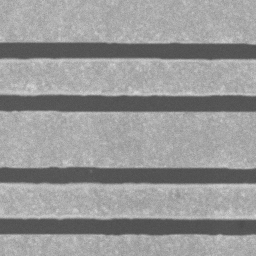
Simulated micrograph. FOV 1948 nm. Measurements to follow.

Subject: lines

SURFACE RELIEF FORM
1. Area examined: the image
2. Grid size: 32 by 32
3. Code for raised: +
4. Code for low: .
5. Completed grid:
++++++++++++++++++++++++++++++++
++++++++++++++++++++++++++++++++
++++++++++++++++++++++++++++++++
++++++++++++++++++++++++++++++++
++++++++++++++++++++++++++++++++
................................
................................
++++++++++++++++++++++++++.+++++
++++++++++++++++++++++++++++++++
++++++++++++++++++++++++++++++++
++++++++++++++++++++++++++++++++
++++++++++++++++++++++++++++++++
................................
................................
++++++++++++++++++++++++++++++++
++++++++++++++++++++++++++++++++
++++++++++++++++++++++++++++++++
++++++++++++++++++++++++++++++++
++++++++++++++++++++++++++++++++
++++++++++++++++++++++++++++++++
++++++++++++++++++++++++++++++++
................................
................................
++++++++++++++++++++++++++++++++
++++++++++++++++++++++++++++++++
++++++++++++++++++++++++++++++++
++++++++++++++++++++++++++++++++
................................
................................
+++++++++++++++++++..+++++.+..++
++++++++++++++++++++++++++++++++
++++++++++++++++++++++++++++++++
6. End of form